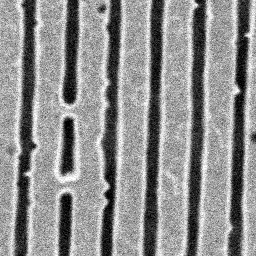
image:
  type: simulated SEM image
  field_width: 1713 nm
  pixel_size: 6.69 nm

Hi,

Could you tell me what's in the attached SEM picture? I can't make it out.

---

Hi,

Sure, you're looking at parallel lines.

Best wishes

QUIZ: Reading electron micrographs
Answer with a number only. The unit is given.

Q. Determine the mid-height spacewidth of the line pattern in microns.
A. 0.0844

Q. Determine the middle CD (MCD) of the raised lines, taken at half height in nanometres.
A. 197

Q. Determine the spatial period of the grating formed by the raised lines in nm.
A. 285